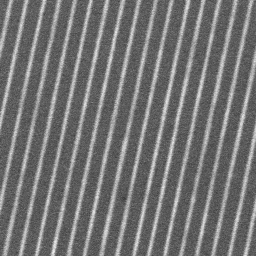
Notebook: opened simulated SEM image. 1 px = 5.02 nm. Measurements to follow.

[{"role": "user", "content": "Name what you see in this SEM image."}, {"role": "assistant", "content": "parallel lines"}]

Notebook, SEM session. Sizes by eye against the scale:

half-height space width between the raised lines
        64.5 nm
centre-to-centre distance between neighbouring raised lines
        0.0787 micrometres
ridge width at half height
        0.016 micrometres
